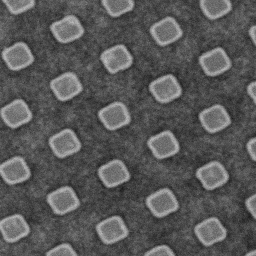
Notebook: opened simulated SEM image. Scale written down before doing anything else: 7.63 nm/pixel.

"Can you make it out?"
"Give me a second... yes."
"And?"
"a regular array of raised bodies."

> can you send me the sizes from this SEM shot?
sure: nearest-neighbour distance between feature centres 430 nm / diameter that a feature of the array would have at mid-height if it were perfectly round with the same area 203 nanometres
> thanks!